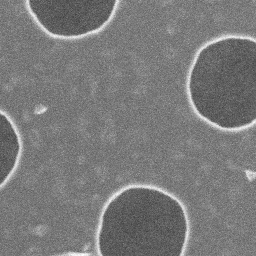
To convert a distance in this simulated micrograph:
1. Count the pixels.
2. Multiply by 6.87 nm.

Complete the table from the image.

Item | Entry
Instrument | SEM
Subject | holes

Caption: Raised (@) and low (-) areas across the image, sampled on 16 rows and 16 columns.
@@-----@@@@@@@@@
@@@---@@@@@@@@@@
@@@@@@@@@@@@@@--
@@@@@@@@@@@@----
@@@@@@@@@@@@----
@@@@@@@@@@@@----
@@@@@@@@@@@@----
@@@@@@@@@@@@@---
-@@@@@@@@@@@@@@@
-@@@@@@@@@@@@@@@
-@@@@@@@@@@@@@@@
@@@@@@@@@@@@@@@@
@@@@@@@----@@@@@
@@@@@@------@@@@
@@@@@@------@@@@
@@@@@@-----@@@@@